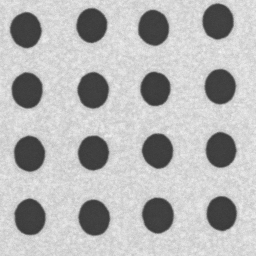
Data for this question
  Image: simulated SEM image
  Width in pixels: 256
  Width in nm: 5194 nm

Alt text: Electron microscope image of a regular array of holes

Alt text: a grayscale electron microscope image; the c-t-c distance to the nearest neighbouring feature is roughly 1.28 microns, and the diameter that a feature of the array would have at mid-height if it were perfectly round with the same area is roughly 684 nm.